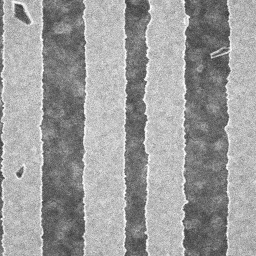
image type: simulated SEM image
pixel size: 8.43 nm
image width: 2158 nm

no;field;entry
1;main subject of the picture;one or a few lines or trenches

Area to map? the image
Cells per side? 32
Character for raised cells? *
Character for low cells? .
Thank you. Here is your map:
*****......*****...****......***
.****......*****...****......***
*****......*****...*****.....***
*****......*****..*****......***
*****......*****..*****......***
*****......*****..*****......***
*****......*****..*****....*****
*****......*****...****......***
*****......*****..*****......***
*****......*****..*****......***
*****......*****..*****.....****
*****.....******..*****.....****
*****......*****..*****.....****
*****......*****..*****.....****
*****......*****..*****......***
*****......*****..*****.....****
*****......*****..*****.....****
*****......*****..*****......***
*****......*****..*****......***
*****......*****...****......***
*****......*****...****.....****
*****......*****..*****......***
*****.....******..*****......***
*****......*****..*****.....****
*****......*****..*****......***
*****......*****..*****......***
*****......*****..*****......***
*****......*****..*****.....****
*****......*****..*****.....****
*****.....******..*****.....****
*****......*****..*****......***
*****......*****..*****.....****